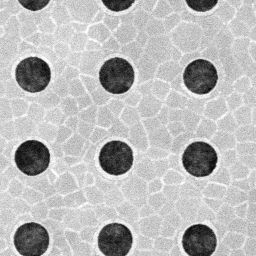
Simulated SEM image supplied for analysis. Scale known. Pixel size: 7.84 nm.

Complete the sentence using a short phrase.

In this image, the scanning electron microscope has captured holes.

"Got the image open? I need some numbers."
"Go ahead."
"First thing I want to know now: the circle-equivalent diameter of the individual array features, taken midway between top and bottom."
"289 nm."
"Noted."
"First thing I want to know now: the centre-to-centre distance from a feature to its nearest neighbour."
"645 nm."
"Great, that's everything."